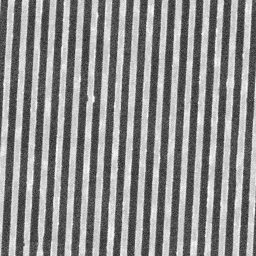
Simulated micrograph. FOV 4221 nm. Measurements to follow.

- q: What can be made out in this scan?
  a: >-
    parallel lines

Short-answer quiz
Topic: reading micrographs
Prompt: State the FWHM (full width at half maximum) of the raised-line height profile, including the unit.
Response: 5.86 pixels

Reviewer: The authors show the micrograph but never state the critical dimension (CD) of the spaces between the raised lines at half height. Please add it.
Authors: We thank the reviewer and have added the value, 136 nm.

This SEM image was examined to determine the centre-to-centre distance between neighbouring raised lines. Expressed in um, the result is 0.23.